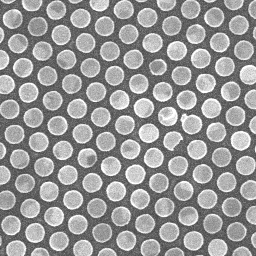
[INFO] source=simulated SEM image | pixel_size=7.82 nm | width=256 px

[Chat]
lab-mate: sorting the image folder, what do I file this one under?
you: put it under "a regular array of raised bodies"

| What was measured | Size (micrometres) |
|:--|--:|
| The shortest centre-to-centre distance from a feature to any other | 0.195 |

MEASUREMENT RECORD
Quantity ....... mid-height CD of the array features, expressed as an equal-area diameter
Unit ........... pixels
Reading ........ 19